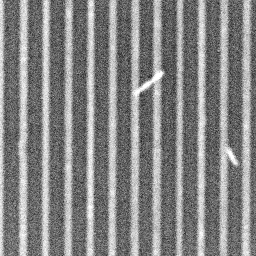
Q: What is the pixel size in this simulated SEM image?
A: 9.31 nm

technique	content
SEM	parallel lines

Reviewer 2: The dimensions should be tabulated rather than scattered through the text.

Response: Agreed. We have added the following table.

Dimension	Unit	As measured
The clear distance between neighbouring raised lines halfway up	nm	165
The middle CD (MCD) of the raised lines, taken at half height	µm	0.0442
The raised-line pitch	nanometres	207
